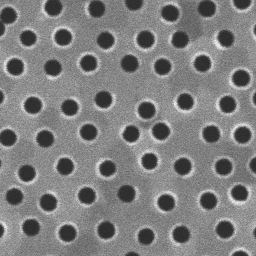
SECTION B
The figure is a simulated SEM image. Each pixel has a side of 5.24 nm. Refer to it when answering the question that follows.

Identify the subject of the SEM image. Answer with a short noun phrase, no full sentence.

a regular array of holes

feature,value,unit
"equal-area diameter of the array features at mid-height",17.5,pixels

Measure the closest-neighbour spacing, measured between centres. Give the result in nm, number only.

165